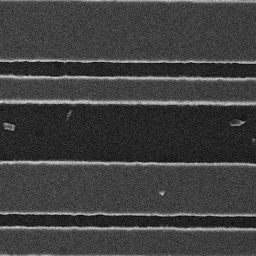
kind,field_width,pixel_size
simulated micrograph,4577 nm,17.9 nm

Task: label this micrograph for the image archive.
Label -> lines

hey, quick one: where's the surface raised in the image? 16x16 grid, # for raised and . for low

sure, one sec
################
################
################
################
################
################
................
................
................
................
################
################
################
################
################
################